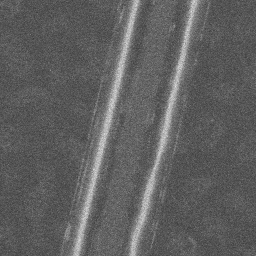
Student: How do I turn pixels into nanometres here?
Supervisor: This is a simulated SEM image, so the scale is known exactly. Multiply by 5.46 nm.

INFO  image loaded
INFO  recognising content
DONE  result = one or a few lines or trenches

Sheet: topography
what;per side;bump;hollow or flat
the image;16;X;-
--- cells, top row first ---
XXXXXXXX----XXXX
XXXXXXXX----XXXX
XXXXXXXX----XXXX
XXXXXXXX---XXXXX
XXXXXXXX---XXXXX
XXXXXXX----XXXXX
XXXXXXX----XXXXX
XXXXXXX---XXXXXX
XXXXXXX---XXXXXX
XXXXXX----XXXXXX
XXXXXX----XXXXXX
XXXXXX---XXXXXXX
XXXXXX---XXXXXXX
XXXXX----XXXXXXX
XXXXX----XXXXXXX
XXXXX---XXXXXXXX